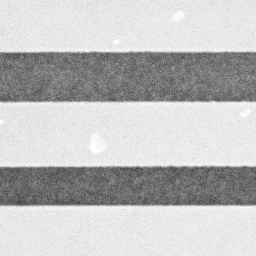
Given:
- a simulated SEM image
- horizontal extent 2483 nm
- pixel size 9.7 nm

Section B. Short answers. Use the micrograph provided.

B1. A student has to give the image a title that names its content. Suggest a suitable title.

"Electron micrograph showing lines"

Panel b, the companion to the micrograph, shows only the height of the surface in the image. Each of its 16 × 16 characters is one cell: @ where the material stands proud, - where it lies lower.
@@@@@@@@@@@@@@@@
@@@@@@@@@@@@@@@@
@@@@@@@@@@@@@@@@
----------------
----------------
----------------
@@@@@@@@@@@@@@@@
@@@@@@@@@@@@@@@@
@@@@@@@@@@@@@@@@
@@@@@@@@@@@@@@@@
----------------
----------------
----------------
@@@@@@@@@@@@@@@@
@@@@@@@@@@@@@@@@
@@@@@@@@@@@@@@@@